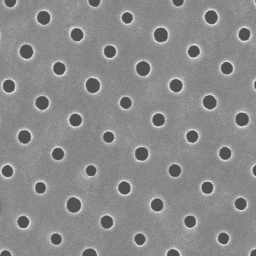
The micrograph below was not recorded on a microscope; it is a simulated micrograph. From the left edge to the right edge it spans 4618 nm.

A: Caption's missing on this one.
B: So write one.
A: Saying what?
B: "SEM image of a regular array of holes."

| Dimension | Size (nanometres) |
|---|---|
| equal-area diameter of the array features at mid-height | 232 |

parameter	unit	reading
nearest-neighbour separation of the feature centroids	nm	666